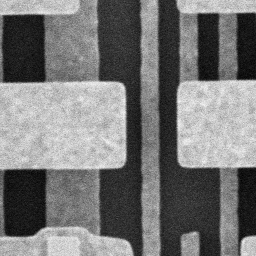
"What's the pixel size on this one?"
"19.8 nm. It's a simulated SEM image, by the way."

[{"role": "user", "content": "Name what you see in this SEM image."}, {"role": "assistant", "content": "wiring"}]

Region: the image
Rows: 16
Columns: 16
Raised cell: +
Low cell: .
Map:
+++++......+++++
................
................
................
................
++++++++...+++++
++++++++...+++++
++++++++...+++++
++++++++...+++++
++++++++...+++++
+++++++.........
................
................
................
..++++..........
++++++++.......+